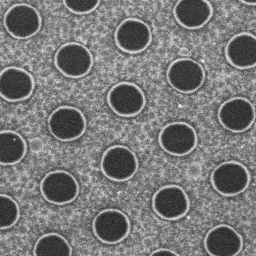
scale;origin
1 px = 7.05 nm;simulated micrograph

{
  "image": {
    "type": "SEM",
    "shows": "a regular array of raised bodies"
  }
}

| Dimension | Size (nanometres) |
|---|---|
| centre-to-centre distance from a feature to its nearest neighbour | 450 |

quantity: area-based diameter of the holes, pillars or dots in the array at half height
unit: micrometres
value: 0.246